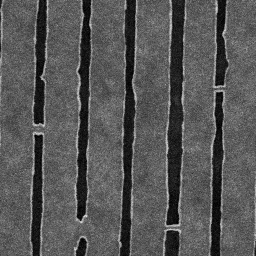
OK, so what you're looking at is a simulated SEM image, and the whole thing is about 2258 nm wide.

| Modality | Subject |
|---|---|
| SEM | parallel lines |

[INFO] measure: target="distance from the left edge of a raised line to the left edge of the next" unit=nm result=400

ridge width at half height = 303 nanometers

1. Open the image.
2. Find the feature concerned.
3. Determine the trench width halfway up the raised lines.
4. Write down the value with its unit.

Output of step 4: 92.5 nm